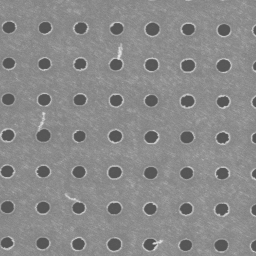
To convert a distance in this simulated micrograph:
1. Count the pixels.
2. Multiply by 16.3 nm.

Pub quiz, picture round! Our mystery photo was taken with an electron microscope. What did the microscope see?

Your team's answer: a regular array of holes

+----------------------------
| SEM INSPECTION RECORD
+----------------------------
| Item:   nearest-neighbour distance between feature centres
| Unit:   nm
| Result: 579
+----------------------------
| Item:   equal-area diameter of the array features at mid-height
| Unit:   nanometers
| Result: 204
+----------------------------